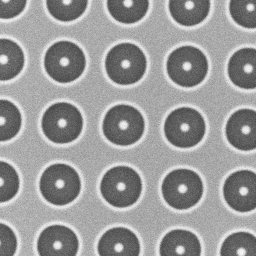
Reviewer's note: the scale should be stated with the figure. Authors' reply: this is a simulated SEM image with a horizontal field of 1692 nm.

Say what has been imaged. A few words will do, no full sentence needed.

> an array of small figures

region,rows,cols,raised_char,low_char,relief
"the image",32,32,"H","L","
LLLHHHLLLLLHHLLLLLLHHLLLLLHHHLLL
LLLHHHLLLLLHHLLLLLLHHLLLLLHHHLLL
LHHHHHHLLLHHHHLLLLHHHHLLLLHHHLLL
HHHHHHHHHHHHHHHHHHHHHHHHHHHHHHLL
HHHHHHHHHHHHHHHHHHHHHHHHHHHHHHHH
LLHHHHLLLLHHHHLLLHHHHHHHHHHHHHHH
LLLHHHLLLLLHHLLLLLHHHLLLLHHHHLLL
LLLHHLLLLLLHHLLLLLHHHLLLLLHHLLLL
LLLHHLLLLLLHHLLLLLHHHLLLLLHHLLLL
LLHHHHLLLLHHHLLLLLHHHLLLLLHHLLLL
HHHHHHHLHHHHHHLLLHHHHHLLLHHHHLLL
HHHHHHHHHHHHHHHHHHHHHHHHHHHHHHHH
LHHHHHHHHHHHHHHHHHHHHHHHHHHHHHHH
LLHHHHLLLLHHHHLLLHHHHHLLHHHHHHLH
LLLHHLLLLLHHHLLLLLHHHLLLLHHHHLLL
LLLHHLLLLLLHHLLLLLHHLLLLLLHHLLLL
LLLHHLLLLLHHHLLLLLHHLLLLLLHHLLLL
LHHHHHLLLLHHHLLLLHHHHLLLLHHHLLLL
HHHHHHHHHHHHHHHHHHHHHHLLHHHHHLLL
HHHHHHHHHHHHHHHHHHHHHHHHHHHHHHHH
LHHHHHLLLHHHHHHHHHHHHHHHHHHHHHHH
LLHHHLLLLLHHHLLLLHHHHLLLLHHHHLLL
LLLHHLLLLLHHLLLLLLHHLLLLLHHHLLLL
LLLHHLLLLLHHLLLLLLHHLLLLLLHHLLLL
LLHHHLLLLLHHHLLLLLHHLLLLLHHHLLLL
HHHHHHLLLHHHHHLLLHHHHLLLLHHHLLLL
HHHHHHHHHHHHHHHHHHHHHHHHHHHHHLLH
HHHHHHHHHHHHHHHHHHHHHHHHHHHHHHHH
LLHHHLLLLHHHHHLLHHHHHHLHHHHHHHHH
LLHHHLLLLLHHHLLLLHHHLLLLLHHHLLLL
LLHHLLLLLLHHLLLLLLHHLLLLLHHHLLLL
LLHHHLLLLLHHLLLLLLHHLLLLLHHLLLLL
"